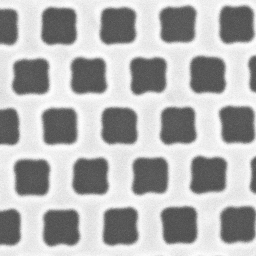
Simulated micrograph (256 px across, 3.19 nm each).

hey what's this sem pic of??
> a regular array of holes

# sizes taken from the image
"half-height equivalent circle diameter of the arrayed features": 130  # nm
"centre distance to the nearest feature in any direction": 185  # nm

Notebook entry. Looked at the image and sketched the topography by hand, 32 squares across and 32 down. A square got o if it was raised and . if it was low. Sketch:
oooooooooooooooooooooooooooooooo
..ooo....oooo....ooo.....oo.....
..ooo.....ooo....ooo.....oo.....
..ooo.....oo.....ooo....ooo.....
..ooo.....oo.....ooo....ooo.....
..oooo...oooo...oooooooooooo.ooo
oooooooooooooooooooooooooooooooo
oo....ooo....ooo.....ooo....ooo.
oo....ooo....ooo.....ooo....ooo.
oo....ooo....ooo.....ooo....ooo.
o.....ooo....ooo.....ooo....ooo.
oo....ooo....ooo....oooo....oooo
oooooooooooooooooooooooooooooooo
oooooo...oooo...ooooo...oooo....
..ooo.....ooo....ooo.....oo.....
..ooo.....ooo....ooo.....ooo....
..ooo.....ooo....ooo.....ooo....
..ooo.....ooo....ooo....oooo....
oooooooooooooooooooooooooooooooo
oooooooooooooooooooooooo.ooooooo
oo....ooo.....ooo....ooo....ooo.
oo....ooo.....ooo....ooo....ooo.
oo....ooo.....ooo....ooo....ooo.
oo....ooo.....oo.....ooo....ooo.
oo...ooooooooooooooooooooooooooo
oooooooooooooooooooooooooooooooo
..oooo....ooo....ooo.....ooo....
...oo.....ooo....ooo.....oo.....
...oo.....ooo....ooo.....oo.....
...oo.....ooo....ooo.....oo.....
..oooo....ooo....oooo.o.oooo.ooo
oooooooooooooooooooooooooooooooo